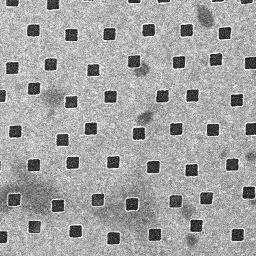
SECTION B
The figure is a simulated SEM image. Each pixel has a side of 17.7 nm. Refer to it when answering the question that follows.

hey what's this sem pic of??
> a regular array of holes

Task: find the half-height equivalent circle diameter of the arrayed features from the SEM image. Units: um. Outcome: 0.255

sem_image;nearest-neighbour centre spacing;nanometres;579